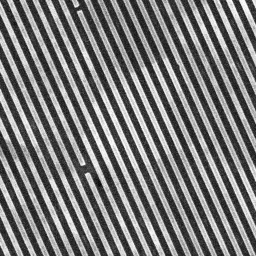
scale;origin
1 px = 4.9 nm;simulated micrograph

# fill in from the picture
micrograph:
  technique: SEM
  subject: parallel lines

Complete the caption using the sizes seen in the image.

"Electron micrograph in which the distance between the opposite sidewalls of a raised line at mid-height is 20.7 nm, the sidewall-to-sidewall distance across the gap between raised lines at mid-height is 36.9 nanometres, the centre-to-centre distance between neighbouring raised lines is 0.0577 µm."